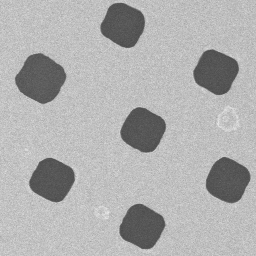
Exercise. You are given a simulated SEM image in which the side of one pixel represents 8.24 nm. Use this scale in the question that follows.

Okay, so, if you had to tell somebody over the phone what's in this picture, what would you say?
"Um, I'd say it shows holes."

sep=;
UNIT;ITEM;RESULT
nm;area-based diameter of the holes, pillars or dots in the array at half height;355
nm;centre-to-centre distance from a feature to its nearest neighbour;803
